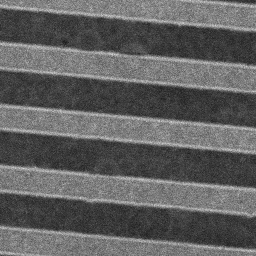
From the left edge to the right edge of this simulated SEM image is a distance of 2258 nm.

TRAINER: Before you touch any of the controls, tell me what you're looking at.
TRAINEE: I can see one or a few lines or trenches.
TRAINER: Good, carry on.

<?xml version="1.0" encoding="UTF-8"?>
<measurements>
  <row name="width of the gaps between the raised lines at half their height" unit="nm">329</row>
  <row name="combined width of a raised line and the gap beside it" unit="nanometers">539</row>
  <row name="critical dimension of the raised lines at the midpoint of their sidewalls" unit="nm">212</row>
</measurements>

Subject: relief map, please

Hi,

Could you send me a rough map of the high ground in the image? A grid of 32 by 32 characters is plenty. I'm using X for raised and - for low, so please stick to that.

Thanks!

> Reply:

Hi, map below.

XXXXXXXXXXXXXXXXXXXXXXXXXXXX----
--------XXXXXXXXXXXXXXXXXXXXXXXX
-------------------XXXXXXXXXXXXX
------------------------------XX
--------------------------------
--------------------------------
XXXXXXXXXXX---------------------
XXXXXXXXXXXXXXXXXXXXXX----------
XXXXXXXXXXXXXXXXXXXXXXXXXXXXXXXX
-----------XXXXXXXXXXXXXXXXXXXXX
---------------------XXXXXXXXXXX
--------------------------------
--------------------------------
XX------------------------------
XXXXXXXXXXXXX-------------------
XXXXXXXXXXXXXXXXXXXXXXXX--------
-----XXXXXXXXXXXXXXXXXXXXXXXXXXX
----------------XXXXXXXXXXXXXXXX
---------------------------XXXXX
--------------------------------
--------------------------------
XXXXXXX-------------------------
XXXXXXXXXXXXXXXXXX--------------
XXXXXXXXXXXXXXXXXXXXXXXXXXXX----
-------XXXXXXXXXXXXXXXXXXXXXXXXX
-----------------XXXXXXXXXXXXXXX
-----------------------------XXX
--------------------------------
--------------------------------
XXXXXXXXXXX---------------------
XXXXXXXXXXXXXXXXXXXXXX----------
XXXXXXXXXXXXXXXXXXXXXXXXXXXXXXXX